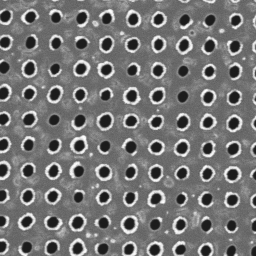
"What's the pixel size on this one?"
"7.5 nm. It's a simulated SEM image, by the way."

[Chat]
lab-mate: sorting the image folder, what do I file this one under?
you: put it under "a regular array of holes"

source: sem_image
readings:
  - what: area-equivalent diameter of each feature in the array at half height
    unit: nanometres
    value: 77.5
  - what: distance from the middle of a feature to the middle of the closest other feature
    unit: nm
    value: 189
